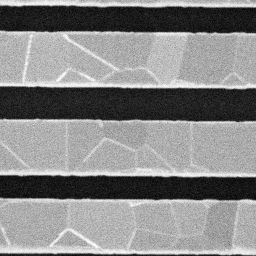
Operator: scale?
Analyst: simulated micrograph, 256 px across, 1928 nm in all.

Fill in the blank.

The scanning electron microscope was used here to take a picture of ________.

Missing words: lines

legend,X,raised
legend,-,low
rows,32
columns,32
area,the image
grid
XXXXXXXXXXXXXXXXXXXXXXXXXXXXXXXX
--------------------------------
--------------------------------
--------------------------------
XXXXXXXXXXXXXXXXXXXXXXXXXXXXXXXX
XXXXXXXXXXXXXXXXXXXXXXXXXXXXXXXX
XXXXXXXXXXXXXXXXXXXXXXXXXXXXXXXX
XXXXXXXXXXXXXXXXXXXXXXXXXXXXXXXX
XXXXXXXXXXXXXXXXXXXXXXXXXXXXXXXX
XXXXXXXXXXXXXXXXXXXXXXXXXXXXXXXX
XXXXXXXXXXXXXXXXXXXXXXXXXXXXXXXX
--------------------------------
--------------------------------
--------------------------------
--------------------------------
XXXXXXXXXXXXXXXXXXXXXXXXXXXXXXXX
XXXXXXXXXXXXXXXXXXXXXXXXXXXXXXXX
XXXXXXXXXXXXXXXXXXXXXXXXXXXXXXXX
XXXXXXXXXXXXXXXXXXXXXXXXXXXXXXXX
XXXXXXXXXXXXXXXXXXXXXXXXXXXXXXXX
XXXXXXXXXXXXXXXXXXXXXXXXXXXXXXXX
XXXXXXXXXXXXXXXXXXXXXXXXXXXXXXXX
--------------------------------
--------------------------------
--------------------------------
XXXXXXXXXXXXXXXXXXXXXXXXXXXXXXXX
XXXXXXXXXXXXXXXXXXXXXXXXXXXXXXXX
XXXXXXXXXXXXXXXXXXXXXXXXXXXXXXXX
XXXXXXXXXXXXXXXXXXXXXXXXXXXXXXXX
XXXXXXXXXXXXXXXXXXXXXXXXXXXXXXXX
XXXXXXXXXXXXXXXXXXXXXXXXXXXXXXXX
---XXXXXXXXXXXXXXXXXXXXXXXXXXXXX